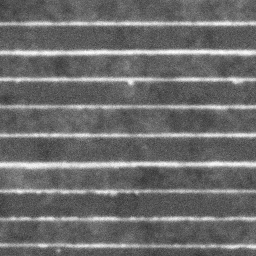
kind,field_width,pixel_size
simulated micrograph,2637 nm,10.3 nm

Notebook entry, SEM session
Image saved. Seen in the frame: lines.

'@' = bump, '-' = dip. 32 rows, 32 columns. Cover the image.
@@@@@@@@@@@@@@@@@@@@@@@@@@@@@@@@
@@@@@@@@@@@@@@@@@@@@@@@@@@@@@@@@
@@@@@@@@@@@@@@@@@@@@@@@@@@@@@@@@
--------------------------------
--------------------------------
--------------------------------
------------@---@@--@@@@@@@-----
@@@@@@@@@@@@@@@@@@@@@@@@@@@@@@@@
@@@@@@@@@@@@@@@@@@@@@@@@@@@@@@@@
@@@@@@@@@@@@@@@@@@@@@@@@@@@@@@@@
--------------------------------
--------------------------------
--------------------------------
@@@@@@@@@@@@@@@@@@@@@@@@@@@@@@@@
@@@@@@@@@@@@@@@@@@@@@@@@@@@@@@@@
@@@@@@@@@@@@@@@@@@@@@@@@@@@@@@@@
@@@@@@@@@@@@@@@@@@@@@@@@@@@@@@@@
--------------------------------
--------------------------------
--------------------------------
--------------------------------
@@@@@@@@@@@@@@@@@@@@@@@@@@@@@@@@
@@@@@@@@@@@@@@@@@@@@@@@@@@@@@@@@
@@@@@@@@@@@@@@@@@@@@@@@@@@@@@@@@
--------------------------------
--------------------------------
--------------------------------
@@@@@@@@@@@@@@@@@@@@@@@@@@@@@@@@
@@@@@@@@@@@@@@@@@@@@@@@@@@@@@@@@
@@@@@@@@@@@@@@@@@@@@@@@@@@@@@@@@
@@@@@@@@@@@@@@@@@@@@@@@@@@@@@@@@
--------------------------------